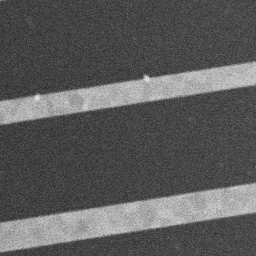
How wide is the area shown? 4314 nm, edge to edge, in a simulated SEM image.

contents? one or a few lines or trenches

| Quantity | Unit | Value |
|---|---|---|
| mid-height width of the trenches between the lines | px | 98.3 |